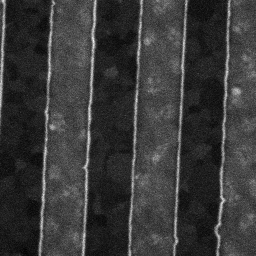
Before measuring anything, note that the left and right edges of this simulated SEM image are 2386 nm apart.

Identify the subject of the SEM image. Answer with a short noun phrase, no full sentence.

one or a few lines or trenches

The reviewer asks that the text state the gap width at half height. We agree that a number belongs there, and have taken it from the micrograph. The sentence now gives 410 nanometres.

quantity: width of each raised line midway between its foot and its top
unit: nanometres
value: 428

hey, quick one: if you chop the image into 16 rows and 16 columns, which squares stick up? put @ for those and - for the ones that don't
@@@---@@@---@@--
@@@---@@@---@@--
@@@---@@@---@@--
@@@---@@@--@@@--
@@@---@@@--@@@--
@@@---@@@--@@@--
@@@---@@@--@@@--
@@@---@@---@@@--
@@@---@@---@@@--
@@@--@@@---@@@--
@@@--@@@---@@@--
@@@--@@@---@@@--
@@@--@@@---@@@--
@@@--@@@---@@@--
@@@--@@@---@@@--
@@@--@@@---@@@--